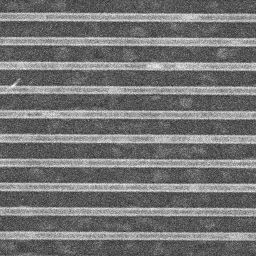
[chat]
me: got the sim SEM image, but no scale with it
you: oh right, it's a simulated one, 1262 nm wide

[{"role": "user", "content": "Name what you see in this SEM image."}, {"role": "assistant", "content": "parallel lines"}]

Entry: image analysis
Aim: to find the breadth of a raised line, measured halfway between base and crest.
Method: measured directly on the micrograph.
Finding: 0.0351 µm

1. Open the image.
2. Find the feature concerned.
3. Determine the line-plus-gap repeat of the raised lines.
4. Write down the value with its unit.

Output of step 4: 24.3 pixels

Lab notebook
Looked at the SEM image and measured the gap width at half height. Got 83.2 nanometres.